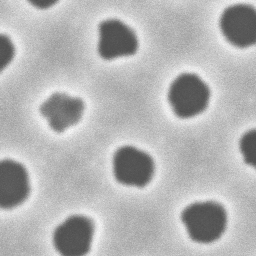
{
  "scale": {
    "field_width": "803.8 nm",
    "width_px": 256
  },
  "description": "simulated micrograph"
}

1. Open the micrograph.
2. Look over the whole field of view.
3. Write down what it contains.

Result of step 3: holes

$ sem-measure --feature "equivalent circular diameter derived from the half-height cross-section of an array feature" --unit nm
134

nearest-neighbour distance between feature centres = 283 nm